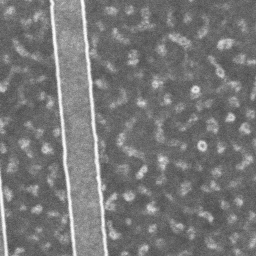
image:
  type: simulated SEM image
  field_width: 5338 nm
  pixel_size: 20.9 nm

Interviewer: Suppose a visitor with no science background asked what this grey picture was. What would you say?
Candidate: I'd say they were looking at one or a few lines or trenches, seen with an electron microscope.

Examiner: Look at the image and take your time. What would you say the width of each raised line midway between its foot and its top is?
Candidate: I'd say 649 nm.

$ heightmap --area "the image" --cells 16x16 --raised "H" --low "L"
LLLHHLLLLLLLLLLL
LLLHHLLLLLLLLLLL
LLLHHLLLLLLLLLLL
LLLHHLLLLLLLLLLL
LLLLHHLLLLLLLLLL
LLLLHHLLLLLLLLLL
LLLLHHLLLLLLLLLL
LLLLHHLLLLLLLLLL
LLLLHHLLLLLLLLLL
LLLLHHLLLLLLLLLL
LLLLHHLLLLLLLLLL
LLLLHHLLLLLLLLLL
LLLLHHLLLLLLLLLL
LLLLHHLLLLLLLLLL
LLLLLHLLLLLLLLLL
LLLLLHHLLLLLLLLL